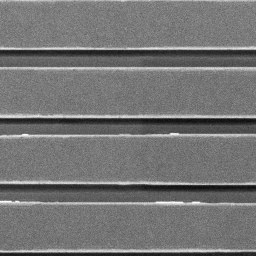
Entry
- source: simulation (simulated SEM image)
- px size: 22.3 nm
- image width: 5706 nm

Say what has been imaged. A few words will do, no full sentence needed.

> lines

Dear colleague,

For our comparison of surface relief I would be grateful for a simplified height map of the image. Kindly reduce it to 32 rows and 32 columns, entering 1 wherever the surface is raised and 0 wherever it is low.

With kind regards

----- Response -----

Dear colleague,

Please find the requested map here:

11111111111111111111111111111111
11111111111111111111111111111111
11111111111111111111111111111111
11111111111111111111111111111111
11111111111111111111111111111111
11111111111111111111111111111111
00000000000000000000000000000000
00000000000000000000000000000000
11111111111111111111111111111111
11111111111111111111111111111111
11111111111111111111111111111111
11111111111111111111111111111111
11111111111111111111111111111111
11111111111111111111111111111111
11111111111111111111111111111111
00000000000000000000000000000000
00000000000000000000000000000000
11111111111111111111111111111111
11111111111111111111111111111111
11111111111111111111111111111111
11111111111111111111111111111111
11111111111111111111111111111111
11111111111111111111111111111111
00000000000000000000000000000000
00000000000000000000000000000000
11111111111111111111111111111111
11111111111111111111111111111111
11111111111111111111111111111111
11111111111111111111111111111111
11111111111111111111111111111111
11111111111111111111111111111111
00000000000000000000000000000000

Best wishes